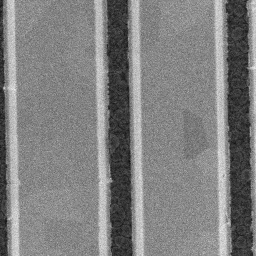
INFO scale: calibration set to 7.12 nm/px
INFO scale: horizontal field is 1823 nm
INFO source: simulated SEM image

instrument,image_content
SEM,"one or a few lines or trenches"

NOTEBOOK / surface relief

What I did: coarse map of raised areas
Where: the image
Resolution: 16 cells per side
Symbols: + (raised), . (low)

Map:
.+++++..++++++..
.+++++...+++++..
.+++++...+++++..
.+++++..++++++..
.+++++...+++++..
.+++++...+++++..
.+++++...+++++..
.+++++...+++++..
.+++++...+++++..
.+++++...+++++..
.+++++...+++++..
.+++++...+++++..
.+++++...+++++..
.+++++...+++++..
.+++++...+++++..
.+++++...+++++..